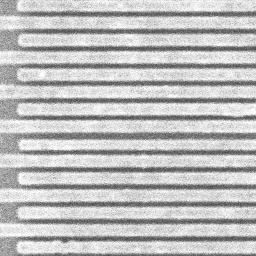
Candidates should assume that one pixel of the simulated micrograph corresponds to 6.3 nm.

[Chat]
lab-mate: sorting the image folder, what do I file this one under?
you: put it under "parallel lines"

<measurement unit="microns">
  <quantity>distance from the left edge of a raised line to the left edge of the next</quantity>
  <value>0.109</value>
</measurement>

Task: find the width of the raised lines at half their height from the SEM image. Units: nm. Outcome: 75.6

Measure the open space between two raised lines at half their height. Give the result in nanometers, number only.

32.3